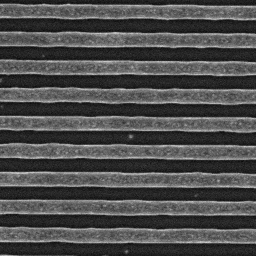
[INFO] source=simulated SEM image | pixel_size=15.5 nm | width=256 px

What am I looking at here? wiring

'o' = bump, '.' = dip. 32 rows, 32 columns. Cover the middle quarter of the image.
oooooooooooooooooooooooooooooooo
oooooooooooooooooooooooooooooooo
ooooooooooo.......oooooooooooooo
................................
................................
................................
ooooooooo....o....oooo..........
oooooooooooooooooooooooooooooooo
oooooooooooooooooooooooooooooooo
.......ooooooooooooooooooooooooo
................................
................................
................................
ooooooooooooooooooooooooooo.oooo
oooooooooooooooooooooooooooooooo
oooooooooooooooooooooooooooooooo
..............................oo
................................
................................
................................
oooooooooooooooooooooooooooooooo
oooooooooooooooooooooooooooooooo
oooooooooooooooooooooooooooooooo
............................oooo
................................
................................
................................
oooooooooooooooooooooooooooooooo
oooooooooooooooooooooooooooooooo
oooooooooooooooooooooooooooooooo
...........oooooooo......ooooooo
................................